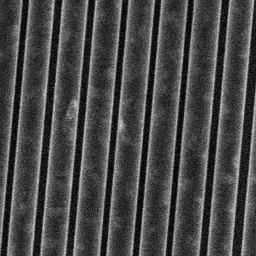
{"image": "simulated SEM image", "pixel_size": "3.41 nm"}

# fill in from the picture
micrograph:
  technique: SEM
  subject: parallel lines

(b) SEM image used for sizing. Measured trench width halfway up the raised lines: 23.4 nm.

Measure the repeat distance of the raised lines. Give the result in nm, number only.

113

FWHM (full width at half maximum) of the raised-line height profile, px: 25.4